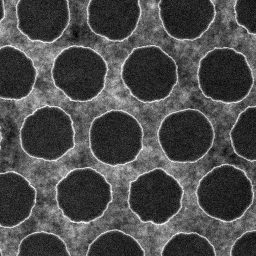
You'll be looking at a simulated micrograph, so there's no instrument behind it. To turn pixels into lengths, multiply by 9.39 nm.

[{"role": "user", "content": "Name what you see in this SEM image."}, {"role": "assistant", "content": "a regular array of raised bodies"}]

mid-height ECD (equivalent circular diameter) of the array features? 520 nm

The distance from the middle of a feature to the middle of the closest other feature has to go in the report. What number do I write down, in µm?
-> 0.643